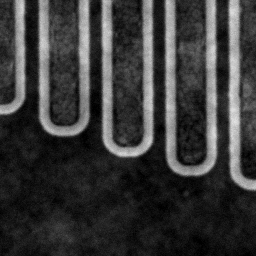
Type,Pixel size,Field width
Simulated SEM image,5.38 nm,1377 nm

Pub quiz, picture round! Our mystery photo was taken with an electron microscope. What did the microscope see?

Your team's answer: one or a few lines or trenches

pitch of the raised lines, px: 63.7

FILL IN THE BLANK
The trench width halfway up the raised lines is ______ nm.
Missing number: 216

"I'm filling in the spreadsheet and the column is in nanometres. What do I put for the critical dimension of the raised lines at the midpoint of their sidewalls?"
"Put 126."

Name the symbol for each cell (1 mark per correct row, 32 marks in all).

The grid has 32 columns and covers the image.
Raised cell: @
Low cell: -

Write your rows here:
---@@-----@@@------@@-----@@@---
---@@-----@@@------@@-----@@@---
---@@------@@------@@-----@@@---
---@@------@@------@@-----@@@---
---@@-----@@@------@@-----@@@---
---@@-----@@@------@@-----@@@---
---@@------@@------@@-----@@@---
---@@------@@------@@-----@@@---
---@@------@@------@@-----@@@---
---@@------@@------@@-----@@@---
---@@------@@------@@-----@@@---
---@@@-----@@------@@-----@@@---
--@@@@-----@@------@@-----@@@---
-@@@@@-----@@------@@-----@@@---
@@@@@@-----@@------@@-----@@@---
@@@@@@----@@@------@@------@@---
@@@@@@@@@@@@@------@@------@@---
@@@@@@@@@@@@@-----@@@-----@@@---
@@@@@@@@@@@@@@----@@@------@@---
@@@@@@@@@@@@@@@@@@@@@-----@@@---
@@@@@@@@@@@@@@@@@@@@@@----@@@---
@@@@@@@@@@@@@@@@@@@@@@@@@@@@@@--
@@@@@@@@@@@@@@@@@@@@@@@@@@@@@@--
@@@@@@@@@@@@@@@@@@@@@@@@@@@@@@@@
@@@@@@@@@@@@@@@@@@@@@@@@@@@@@@@@
@@@@@@@@@@@@@@@@@@@@@@@@@@@@@@@@
@@@@@@@@@@@@@@@@@@@@@@@@@@@@@@@@
@@@@@@@@@@@@@@@@@@@@@@@@@@@@@@@@
@@@@@@@@@@@@@@@@@@@@@@@@@@@@@@@@
@@@@@@@@@@@@@@@@@@@@@@@@@@@@@@@@
@@@@@@@@@@@@@@@@@@@@@@@@@@@@@@@@
@@@@@@@@@@@@@@@@@@@@@@@@@@@@@@@@